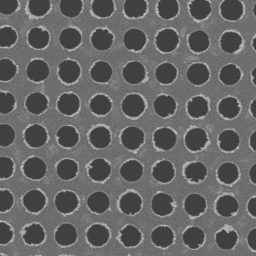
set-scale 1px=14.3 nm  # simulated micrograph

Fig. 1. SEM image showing a regular array of holes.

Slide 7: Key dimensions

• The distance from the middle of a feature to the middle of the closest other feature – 458 nm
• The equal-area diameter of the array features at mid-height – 0.315 µm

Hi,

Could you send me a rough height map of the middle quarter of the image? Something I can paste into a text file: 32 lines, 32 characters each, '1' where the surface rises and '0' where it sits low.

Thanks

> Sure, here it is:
00001110000011100000111100011111
00001110000011100000111000001110
00001110000011100000111000001110
00011110000011100000111000001110
00011111000111110001111100011110
11111111111111111111111111111111
11111111111111111111111111111111
00011111111111111111111111111111
00001110000111100001111000011111
00001100000011100000111000001110
00001100000011000000110000001110
00011110000011100000111000001110
00111111001111100001111000011110
11111111111111111111111111111111
11111111111111111111111111111111
01111111111111111111111111111111
00011110000111100001111000011111
00001100000011000000110000001110
00001100000011000000110000001100
00001110000011000000111000001100
00111110000111100001111000011110
11111111111111111111111110111111
11111111111111111111111111111111
11111111111111111111111111111111
00011110000111110001111100011111
00011110000111100000111000011110
00001100000011000000110000001100
00011100000111000000110000001100
00111110000111100001111000011110
11111111111111110111111110111111
11111111111111111111111111111111
11111111111111111111111111111111